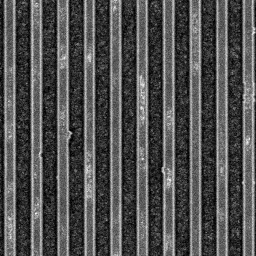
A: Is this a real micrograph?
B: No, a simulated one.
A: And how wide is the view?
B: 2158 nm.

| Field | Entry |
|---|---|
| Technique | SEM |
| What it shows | parallel lines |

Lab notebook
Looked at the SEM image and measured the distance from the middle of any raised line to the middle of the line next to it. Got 223 nm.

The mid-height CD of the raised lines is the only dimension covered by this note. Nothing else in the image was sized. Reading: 85.3 nm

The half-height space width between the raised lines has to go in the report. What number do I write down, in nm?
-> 139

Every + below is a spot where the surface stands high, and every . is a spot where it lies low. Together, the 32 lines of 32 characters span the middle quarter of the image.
+....++.....++....+++....++.....
+....++.....++....+++....++.....
+....++.....++....+++....++.....
+....++.....++....+++....++.....
+....++.....++....+++....+++....
+....++.....++....+++....+++....
+....++.....++....+++....+++....
+....++.....++....+++....+++....
+....++.....++....+++....+++....
+....++.....++....+++....+++....
+....++.....++....+++....+++....
+....++.....++....+++....+++....
+....++.....++....+++....+++....
+....++.....++....+++....+++....
+....++.....++....+++....++.....
+....++.....++....+++....++.....
+....++.....++....+++....++.....
++...++.....++....+++....++.....
++...++.....++....+++....++.....
+....++.....++....+++....++.....
+....++.....++....+++....++.....
+....++.....++....+++....++.....
+....++.....++....+++....++.....
+....++.....++....+++....++.....
+....++.....++....+++....++.....
+....++.....++....+++....++.....
+....++.....++....+++....++.....
+....++.....++....+++....++.....
+....++.....++....+++....++.....
+....++.....++....+++....++.....
+....++.....++....+++....++.....
+....++.....++....+++....++.....